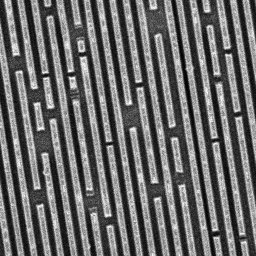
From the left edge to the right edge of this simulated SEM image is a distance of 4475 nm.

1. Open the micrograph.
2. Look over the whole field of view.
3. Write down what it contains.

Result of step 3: parallel lines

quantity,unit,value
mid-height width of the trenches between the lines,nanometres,112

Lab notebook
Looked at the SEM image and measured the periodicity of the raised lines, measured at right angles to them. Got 229 nm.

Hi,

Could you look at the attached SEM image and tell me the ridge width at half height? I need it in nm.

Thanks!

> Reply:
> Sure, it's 110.